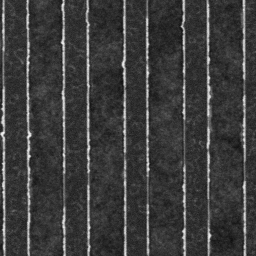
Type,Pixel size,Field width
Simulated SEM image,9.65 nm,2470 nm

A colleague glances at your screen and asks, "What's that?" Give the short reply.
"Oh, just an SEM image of parallel lines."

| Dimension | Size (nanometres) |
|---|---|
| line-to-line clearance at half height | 333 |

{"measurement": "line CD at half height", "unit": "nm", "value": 247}